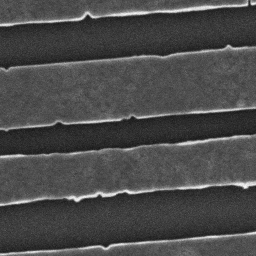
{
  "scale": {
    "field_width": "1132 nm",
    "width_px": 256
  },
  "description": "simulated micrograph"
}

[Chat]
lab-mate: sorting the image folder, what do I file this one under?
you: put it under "one or a few lines or trenches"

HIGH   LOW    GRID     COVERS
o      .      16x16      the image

ooooooooooooo...
o...............
................
..........oooooo
oooooooooooooooo
oooooooooooooooo
oooooooooooooooo
ooooooo.........
...............o
.....ooooooooooo
oooooooooooooooo
oooooooooooooooo
oo..............
................
................
.....ooooooooooo